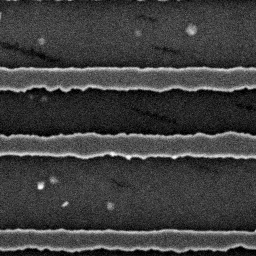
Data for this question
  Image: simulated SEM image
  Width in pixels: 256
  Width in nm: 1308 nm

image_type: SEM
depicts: lines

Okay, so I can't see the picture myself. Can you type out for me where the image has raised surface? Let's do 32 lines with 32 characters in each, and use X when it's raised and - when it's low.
--------------------------------
--------------------------------
--------------------------------
--------------------------------
--------------------------------
--------------------------------
--------------------------------
--------------------------------
X-XXX---XX-XXXXXX-XXXX-XXXX--XXX
XXXXXXXXXXXXXXXXXXXXXXXXXXXXXXXX
XXXXXXXXXXXXXXXXXXXXXXXXXXXXXXXX
--------------------------------
--------------------------------
--------------------------------
--------------------------------
--------------------------------
--------------------------------
XXXXXXXXXXXXXXXXXXXXXXXXXXXXXXXX
XXXXXXXXXXXXXXXXXXXXXXXXXXXXXXXX
-------X-XXX---XXXXXXXX-XXXXXXXX
--------------------------------
--------------------------------
--------------------------------
--------------------------------
--------------------------------
--------------------------------
--------------------------------
--------------------------------
--------------------------------
XXXXXXXXXXXXXXXXXXXXXXXXXXXXXXXX
XXXXXXXXXXXXXXXXXXXXXXXXXXXXXXXX
----------------------X---------